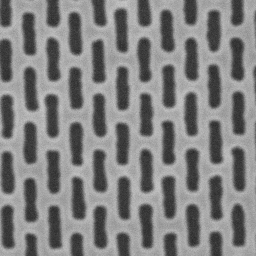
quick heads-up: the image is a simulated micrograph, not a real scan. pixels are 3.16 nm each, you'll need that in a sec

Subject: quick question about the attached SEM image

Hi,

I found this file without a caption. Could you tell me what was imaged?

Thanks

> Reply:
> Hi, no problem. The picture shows a regular array of holes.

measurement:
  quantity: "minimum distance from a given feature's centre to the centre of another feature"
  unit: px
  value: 35.3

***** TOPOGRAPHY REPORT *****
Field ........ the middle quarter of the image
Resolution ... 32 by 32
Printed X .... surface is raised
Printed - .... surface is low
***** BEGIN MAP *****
XXXXXXX---XXXX-XXXX--XXXX--XXX--
X---XXX---XXX---XXX--XXX----XX--
X----XX---XXX---XXX---XX----XX--
X---XXX----XX---XXX---XXX---XXX-
X---XXX---XXX---XXX--XXXX---XXXX
X----XXXXXXXX---XXXXXXXXX---XXXX
X----XXXXXXXX----XXXXXXXX---XXXX
X----XXX--XXX---XXX--XXXX---XXX-
X----XX---XXX---XXX---XX----XX--
XX---XX---XXX---XXX---XXX---XX--
XX---XX---XXX---XXX---XXX---XX--
XXXXXXX---XXXX--XXX---XXXXXXXX--
XXXXXXX----XXXXXXXX---XXXXXXXX--
XXXXXXX----XXXXXXXX---XXXXXXXX--
XXX-XXX----XXX-XXXX---XX---XXX--
X---XXX----XX---XXX---XX---XXX--
X----XX----XX---XXX---XXX---XXX-
X----XXX---XX---XXX---XXX---XXX-
X----XXXX-XXX---XXXXXXXX----XXXX
X----XXXXXXXX---XXXXXXXX----XXXX
X----XXXXXXXX---XXXXXXXX----XXXX
X----XXX-XXXX---XXX--XXX----XXX-
XX---XX---XXX---XXX---XX----XX--
XX---XX---XXX---XXX---XX----XX--
XX---XX---XXX---XXX---XXX---XXX-
XXX-XXX---XXXXXXXXX---XXXXXXXXX-
XXXXXXX---XXXXXXXXX---XXXXXXXXX-
XXXXXXX---XXXXXXXXX---XXXXXXXXX-
XX--XXX----XXX--XXX---XXX---XX--
XX---XX----XX----XX---XX----XX--
XX---XX----XXX---XX---XXX---XXX-
XX---XXX---XX----XX---XXX---XXX-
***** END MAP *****